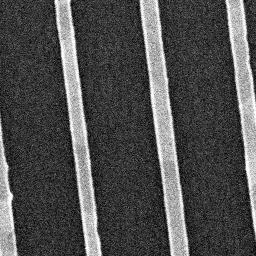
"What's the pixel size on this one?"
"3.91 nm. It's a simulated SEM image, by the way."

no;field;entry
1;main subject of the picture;one or a few lines or trenches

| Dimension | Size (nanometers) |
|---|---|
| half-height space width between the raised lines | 275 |